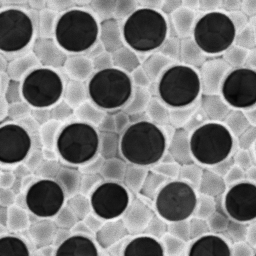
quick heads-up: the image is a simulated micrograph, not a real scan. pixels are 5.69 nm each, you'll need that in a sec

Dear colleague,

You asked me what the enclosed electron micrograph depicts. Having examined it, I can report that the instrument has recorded a regular array of holes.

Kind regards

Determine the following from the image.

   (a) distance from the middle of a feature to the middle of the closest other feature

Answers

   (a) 368 nm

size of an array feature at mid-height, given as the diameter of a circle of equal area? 40.6 pixels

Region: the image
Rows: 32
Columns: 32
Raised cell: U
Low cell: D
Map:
UUUUUUUUUUUUUUUUUUUUUUUUUUUUUUUU
DDDUUUUUUDDUUUUUUDDDUUUUUUUUUUUU
DDDDUUUDDDDDUUUUDDDDDUUUUDDDDUUU
DDDDUUUDDDDDUUUDDDDDDUUUDDDDDUUU
DDDDUUUDDDDDUUUUDDDDDUUUDDDDDUUU
DDDUUUUUDDDDUUUUDDDDUUUUUDDDDUUU
UUUUUUUUUUUUUUUUUUUUUUUUUUDUUUUU
UUUUUUUUUUUUUUUUUUUUUUUUUUUUUUUU
UUUUUUUUUUUUUUUUUUUUUDDDUUUUUUUU
UUUDDDDUUUUUDDDDUUUUDDDDDUUUUDDD
UUUDDDDDUUUDDDDDUUUUDDDDDUUUDDDD
UUUDDDDDUUUDDDDDUUUUDDDDDUUUDDDD
UUUDDDDUUUUUDDDDUUUUUDDDUUUUDDDD
UUUUUUUUUUUUUDUUUUUUUUUUUUUUUUUU
UUUUUUUUUUUUUUUUUUUUUUUUUUUUUUUU
UUUUUUUUUDDUUUUUUDDUUUUUUUDUUUUU
DDDUUUUUDDDDUUUUDDDDUUUUDDDDDUUU
DDDDUUUDDDDDUUUDDDDDDUUUDDDDDUUU
DDDDUUUDDDDDUUUDDDDDDUUUDDDDDUUU
DDDUUUUUDDDDUUUUDDDDUUUUDDDDUUUU
UUUUUUUUUUUUUUUUUDDUUUUUUUUUUUUU
UUUUUUUUUUUUUUUUUUUUUUUUUUUUUUUU
UUUUUUUUUUUUUUUUUUUUUUUUUUUUUUUU
UUUUDDDDUUUUDDDUUUUUDDDDUUUUUDDD
UUUDDDDDUUUDDDDDUUUUDDDDUUUUDDDD
UUUDDDDDUUUDDDDDUUUUDDDDUUUUDDDD
UUUUDDDUUUUUDDDUUUUUDDDDUUUUDDDD
UUUUUUUUUUUUUUUUUUUUUDDUUUUUUUDU
UUUUUUUUUUUUUUUUUUUUUUUUUUUUUUUU
UUUUUUUUUUUUUUUUUUUUUUUUUUDUUUUU
DDDUUUUUDDDDUUUUDDDDUUUUDDDDUUUU
DDDDUUUDDDDDUUUUDDDDUUUUDDDDDUUU